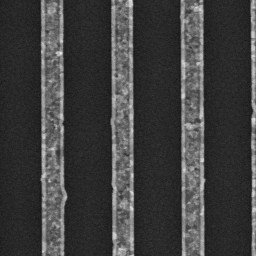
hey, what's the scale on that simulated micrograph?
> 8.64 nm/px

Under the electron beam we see one or a few lines or trenches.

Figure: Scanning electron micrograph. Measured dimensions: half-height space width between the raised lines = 444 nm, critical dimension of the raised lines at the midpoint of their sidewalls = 156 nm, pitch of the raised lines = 69.9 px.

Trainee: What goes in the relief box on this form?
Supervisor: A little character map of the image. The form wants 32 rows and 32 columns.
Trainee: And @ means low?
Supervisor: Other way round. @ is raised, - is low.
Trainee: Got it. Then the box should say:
-----@@@------@@-------@@-------
-----@@@------@@-------@@-------
-----@@@------@@-------@@-------
-----@@@------@@-------@@-------
-----@@@------@@-------@@-------
------@@------@@-------@@-------
-----@@@------@@-------@@-------
-----@@@------@@-------@@-------
-----@@@------@@-------@@-------
------@@------@@-------@@-------
------@@------@@-------@@-------
------@@------@@-------@@-------
------@@------@@-------@@-------
-----@@@------@@-------@@-------
-----@@@------@@-------@@-------
------@@------@@-------@@-------
-----@@@------@@-------@@-------
-----@@@------@@-------@@-------
-----@@@------@@-------@@-------
------@@------@@-------@@-------
------@@------@@-------@@-------
-----@@@------@@-------@@-------
-----@@@------@@-------@@-------
------@@------@@-------@@-------
------@@------@@-------@@-------
-----@@@------@@-------@@-------
-----@@@------@@-------@@-------
------@@------@@-------@@-------
-----@@@------@@-------@@-------
-----@@@------@@-------@@-------
-----@@@------@@-------@@-------
------@@------@@-------@@-------